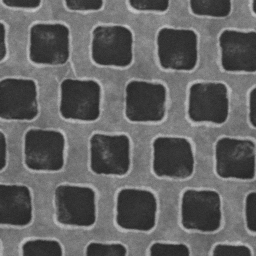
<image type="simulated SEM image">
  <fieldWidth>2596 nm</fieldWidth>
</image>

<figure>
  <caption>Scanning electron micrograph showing a regular array of holes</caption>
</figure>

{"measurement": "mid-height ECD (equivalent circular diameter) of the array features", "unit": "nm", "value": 470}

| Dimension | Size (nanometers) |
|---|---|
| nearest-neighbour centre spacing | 619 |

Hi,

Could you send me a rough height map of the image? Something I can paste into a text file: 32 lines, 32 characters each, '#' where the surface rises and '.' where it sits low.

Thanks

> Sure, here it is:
.....###.....###.....###.....##.
##################..####.....###
################################
.###.....###....####..##########
.###.....##......###.....##.....
.###.....##......###.....##.....
.##......##......##......##.....
####.....###.....###.....##.....
#######..######.####....####....
#######...######################
.....##.....####....####....####
.....###.....###.....###.....##.
.....##......###.....##......##.
.....##......###.....##......##.
.....###....####.....##......##.
##########################..###.
###.....########################
.##.....###.....###.....###.....
.##.....###.....###.....###.....
.##.....###.....###.....###.....
.##.....###.....###.....###.....
###########.....###.....###.....
######################.#########
....###....####..###############
....###.....##......###....####.
....###.....##......###.....###.
....###.....##......##......##..
....###.....##......###.....###.
###############....####.....###.
################################
###.....###....####....####...##
###.....###.....###.....##......